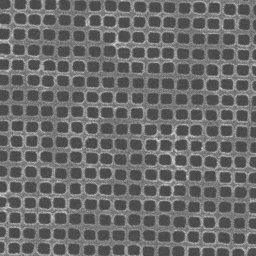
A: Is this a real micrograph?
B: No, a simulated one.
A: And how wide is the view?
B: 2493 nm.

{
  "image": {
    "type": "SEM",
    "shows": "a regular array of holes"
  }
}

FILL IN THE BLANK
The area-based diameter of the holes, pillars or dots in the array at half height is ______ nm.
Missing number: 122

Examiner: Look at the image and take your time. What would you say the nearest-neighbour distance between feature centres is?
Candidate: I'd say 141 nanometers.